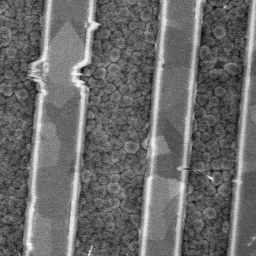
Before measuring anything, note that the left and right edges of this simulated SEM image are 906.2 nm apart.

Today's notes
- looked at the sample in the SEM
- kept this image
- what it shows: one or a few lines or trenches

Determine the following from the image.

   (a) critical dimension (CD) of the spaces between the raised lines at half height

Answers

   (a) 222 nm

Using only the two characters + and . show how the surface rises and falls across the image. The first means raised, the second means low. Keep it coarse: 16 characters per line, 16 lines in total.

...+++....++....
...+++....++....
...+++....++....
...++.....++....
..+++.....++....
...++.....++...+
...++.....++...+
..+++.....++...+
..+++.....++...+
..+++.....++...+
..+++....++....+
..+++....++....+
..+++....++....+
..+++....++....+
..++.....++....+
..++.....++....+